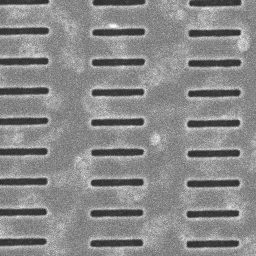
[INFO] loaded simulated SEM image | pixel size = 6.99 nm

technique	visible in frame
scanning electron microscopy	a regular array of holes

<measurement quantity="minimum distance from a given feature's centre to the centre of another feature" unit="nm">210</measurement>